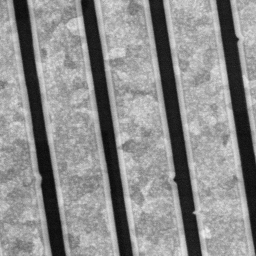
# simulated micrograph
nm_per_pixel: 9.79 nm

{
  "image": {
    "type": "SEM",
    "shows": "one or a few lines or trenches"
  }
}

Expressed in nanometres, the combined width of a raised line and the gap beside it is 657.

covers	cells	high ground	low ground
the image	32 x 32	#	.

#...######..######...######..###
##..######..######...######..###
##..######..#######..######..###
##..######...######..######...##
##..######...######..######...##
##..#######..######...#####...##
##...######..######...######..##
##...######..######...######..##
###..######..#######..######..##
###..######...######..######...#
###..######...######..######...#
###..#######..######..######...#
###..#######..######...######..#
###...######..######...######..#
####..######..######...######..#
####..######..#######..######..#
####..######...######..######...
####..#######..######..######...
####..#######..######...#####...
####...######..######...######..
####...######..######...######..
#####..######..#######..######..
#####..######..######...######..
#####..######...######..######..
#####..#######..######..######..
#####..#######..######...######.
#####...######..######...######.
######..######..#######..######.
######..######..#######..######.
######..######...######..######.
######..######...######..######.
######..#######..######...######